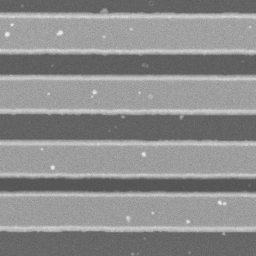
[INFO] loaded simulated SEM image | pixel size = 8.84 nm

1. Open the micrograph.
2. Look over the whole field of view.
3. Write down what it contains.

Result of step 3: lines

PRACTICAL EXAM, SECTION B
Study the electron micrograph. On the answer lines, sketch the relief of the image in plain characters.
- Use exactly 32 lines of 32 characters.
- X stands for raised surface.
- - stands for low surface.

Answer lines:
--------------------------------
--------------------------------
XXXXXXXXXXXXXXXXXXXXXXXXXXXXXXXX
XXXXXXXXXXXXXXXXXXXXXXXXXXXXXXXX
XXXXXXXXXXXXXXXXXXXXXXXXXXXXXXXX
XXXXXXXXXXXXXXXXXXXXXXXXXXXXXXXX
XXXXXXXXXXXXXXXXXXXXXXXXXXXXXXXX
--------------------------------
--------------------------------
--------------------------------
XXXXXXXXXXXXXXXXXXXXXXXXXXXXXXXX
XXXXXXXXXXXXXXXXXXXXXXXXXXXXXXXX
XXXXXXXXXXXXXXXXXXXXXXXXXXXXXXXX
XXXXXXXXXXXXXXXXXXXXXXXXXXXXXXXX
--------------------------------
--------------------------------
--------------------------------
--------------------------------
XXXXXXXXXXXXXXXXXXXXXXXXXXXXXXXX
XXXXXXXXXXXXXXXXXXXXXXXXXXXXXXXX
XXXXXXXXXXXXXXXXXXXXXXXXXXXXXXXX
XXXXXXXXXXXXXXXXXXXXXXXXXXXXXXXX
--------------------------------
--------------------------------
XXXXXXXXXXXXXXXXXXXXXXXXXXXXXXXX
XXXXXXXXXXXXXXXXXXXXXXXXXXXXXXXX
XXXXXXXXXXXXXXXXXXXXXXXXXXXXXXXX
XXXXXXXXXXXXXXXXXXXXXXXXXXXXXXXX
XXXXXXXXXXXXXXXXXXXXXXXXXXXXXXXX
--------------------------------
--------------------------------
--------------------------------